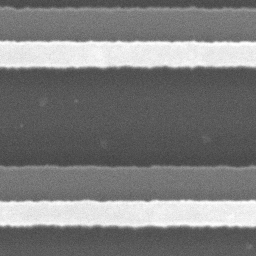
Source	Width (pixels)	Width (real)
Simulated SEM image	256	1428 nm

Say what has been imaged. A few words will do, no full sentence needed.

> lines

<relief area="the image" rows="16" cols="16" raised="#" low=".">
#...............
################
################
################
................
................
................
................
................
................
#######.######.#
################
################
################
................
................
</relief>